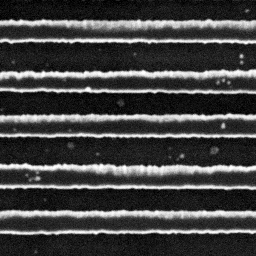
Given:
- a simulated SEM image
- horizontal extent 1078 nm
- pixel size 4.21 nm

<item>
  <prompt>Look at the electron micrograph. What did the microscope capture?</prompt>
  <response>lines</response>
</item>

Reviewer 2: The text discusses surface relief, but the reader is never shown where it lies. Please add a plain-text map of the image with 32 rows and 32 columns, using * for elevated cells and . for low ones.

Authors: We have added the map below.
................................
................................
................................
********************************
********************************
................................
................................
................................
................................
********************************
********************************
.......**...********************
................................
................................
......*....*...***...*.**.******
********************************
********************************
................................
................................
................................
................................
********************************
********************************
.......***.**.******************
................................
................................
.**.**.**.....**...........*....
********************************
********************************
................................
................................
................................